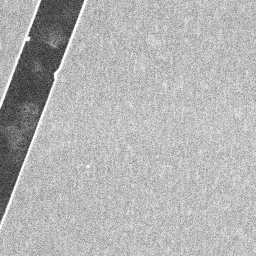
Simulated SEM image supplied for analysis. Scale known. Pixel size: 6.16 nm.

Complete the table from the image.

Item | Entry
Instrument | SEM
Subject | one or a few lines or trenches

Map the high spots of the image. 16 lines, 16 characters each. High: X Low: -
XX---XXXXXXXXXXX
XX---XXXXXXXXXXX
XX--XXXXXXXXXXXX
X---XXXXXXXXXXXX
X---XXXXXXXXXXXX
---XXXXXXXXXXXXX
---XXXXXXXXXXXXX
---XXXXXXXXXXXXX
--XXXXXXXXXXXXXX
--XXXXXXXXXXXXXX
-XXXXXXXXXXXXXXX
-XXXXXXXXXXXXXXX
-XXXXXXXXXXXXXXX
XXXXXXXXXXXXXXXX
XXXXXXXXXXXXXXXX
XXXXXXXXXXXXXXXX